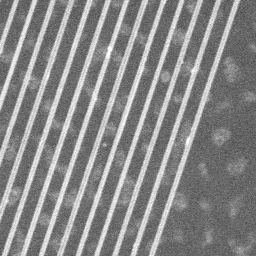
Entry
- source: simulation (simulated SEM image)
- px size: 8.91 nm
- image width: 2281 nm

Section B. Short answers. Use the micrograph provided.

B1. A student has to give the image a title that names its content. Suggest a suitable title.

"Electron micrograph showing parallel lines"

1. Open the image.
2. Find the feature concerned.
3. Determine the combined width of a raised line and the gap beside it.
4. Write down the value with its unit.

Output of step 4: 155 nm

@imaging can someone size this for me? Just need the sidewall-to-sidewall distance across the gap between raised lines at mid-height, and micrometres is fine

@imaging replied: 0.121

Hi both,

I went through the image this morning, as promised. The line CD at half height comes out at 32.7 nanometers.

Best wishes